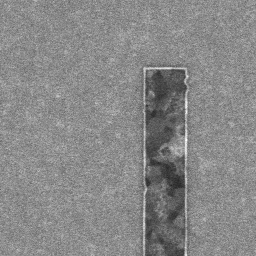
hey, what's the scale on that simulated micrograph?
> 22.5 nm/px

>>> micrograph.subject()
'one or a few lines or trenches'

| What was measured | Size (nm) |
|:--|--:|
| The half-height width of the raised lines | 936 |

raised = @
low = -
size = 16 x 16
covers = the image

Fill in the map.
----------------
----------------
----------------
----------------
---------@@-----
---------@@@----
---------@@@----
---------@@@----
---------@@@----
---------@@@----
---------@@@----
---------@@@----
---------@@@----
---------@@@----
---------@@@----
---------@@@----